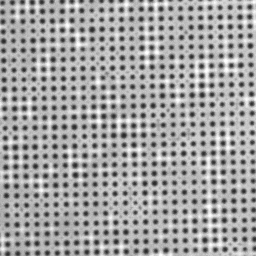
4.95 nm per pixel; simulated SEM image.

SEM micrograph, a regular array of holes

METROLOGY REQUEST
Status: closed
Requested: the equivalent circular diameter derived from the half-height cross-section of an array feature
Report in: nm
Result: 24.3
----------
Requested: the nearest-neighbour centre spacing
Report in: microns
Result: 0.047